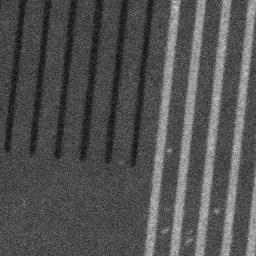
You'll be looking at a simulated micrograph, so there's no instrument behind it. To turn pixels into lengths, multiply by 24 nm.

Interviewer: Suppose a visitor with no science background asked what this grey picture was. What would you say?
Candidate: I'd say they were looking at parallel lines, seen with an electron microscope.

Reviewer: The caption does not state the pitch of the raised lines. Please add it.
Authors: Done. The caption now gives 608 nm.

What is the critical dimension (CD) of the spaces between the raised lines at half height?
424 nm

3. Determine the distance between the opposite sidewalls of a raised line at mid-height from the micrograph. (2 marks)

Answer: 0.182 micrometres